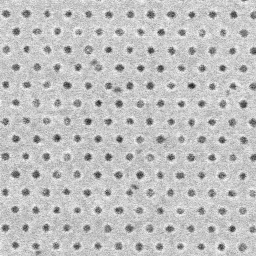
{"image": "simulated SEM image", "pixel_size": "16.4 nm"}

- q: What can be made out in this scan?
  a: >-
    a regular array of holes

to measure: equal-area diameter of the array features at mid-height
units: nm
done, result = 141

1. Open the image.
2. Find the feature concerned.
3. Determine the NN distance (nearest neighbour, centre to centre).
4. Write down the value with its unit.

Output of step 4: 20.2 px